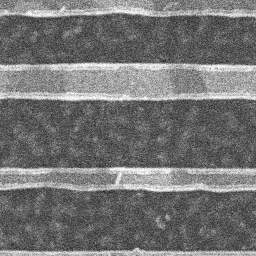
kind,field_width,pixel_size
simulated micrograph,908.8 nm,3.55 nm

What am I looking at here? one or a few lines or trenches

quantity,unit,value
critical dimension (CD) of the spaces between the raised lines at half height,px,62.5